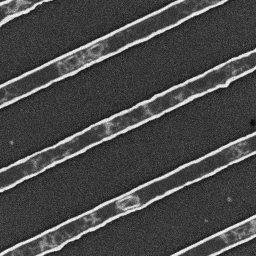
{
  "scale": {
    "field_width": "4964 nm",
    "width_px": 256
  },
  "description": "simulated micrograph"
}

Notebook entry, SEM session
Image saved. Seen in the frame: one or a few lines or trenches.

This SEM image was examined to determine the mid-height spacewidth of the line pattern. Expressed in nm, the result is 1110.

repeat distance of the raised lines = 75.4 pixels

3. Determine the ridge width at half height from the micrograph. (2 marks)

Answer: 350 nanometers